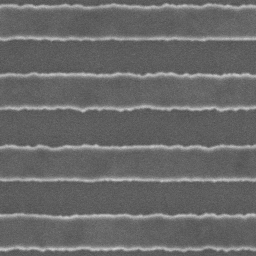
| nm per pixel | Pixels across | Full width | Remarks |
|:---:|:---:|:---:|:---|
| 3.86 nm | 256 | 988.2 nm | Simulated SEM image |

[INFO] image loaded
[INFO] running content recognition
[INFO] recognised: lines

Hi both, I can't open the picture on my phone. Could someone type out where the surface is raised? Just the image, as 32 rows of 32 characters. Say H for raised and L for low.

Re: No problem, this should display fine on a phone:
LLLLLLLLLLLLLLLLLLLLLLLLLLLLLLLL
HHHHHHHHHHHHHHHHHHHHHHHHHHHHHHHH
HHHHHHHHHHHHHHHHHHHHHHHHHHHHHHHH
HHHHHHHHHHHHHHHHHHHHHHHHHHHHHHHH
HHHHHHHHHHHHHHHHHHHHHHHHHHHHHHHH
LLLLLLLLLLLLLLLLLLLLLLLLLLLLLLLL
LLLLLLLLLLLLLLLLLLLLLLLLLLLLLLLL
LLLLLLLLLLLLLLLLLLLLLLLLLLLLLLLL
LLLLLLLLLLLLLLLLLLLLLLLLLLLLLLLL
HHHHHHHHHHHHHHHHHHHHHHHHHHHHHHHH
HHHHHHHHHHHHHHHHHHHHHHHHHHHHHHHH
HHHHHHHHHHHHHHHHHHHHHHHHHHHHHHHH
HHHHHHHHHHHHHHHHHHHHHHHHHHHHHHHH
HHHHHHHHHHHHHHHHHHHHHHHHHHHHHHHH
LLLLLLLLLLLLLLLLLLLLLLLLLLLLLLLL
LLLLLLLLLLLLLLLLLLLLLLLLLLLLLLLL
LLLLLLLLLLLLLLLLLLLLLLLLLLLLLLLL
LLLLLLLLLLLLLLLLLLLLLLLLLLLLLLLL
HHHHHHHHHHHHHHHHHHHHHHHHHHHHHHHH
HHHHHHHHHHHHHHHHHHHHHHHHHHHHHHHH
HHHHHHHHHHHHHHHHHHHHHHHHHHHHHHHH
HHHHHHHHHHHHHHHHHHHHHHHHHHHHHHHH
HHHHHHHHHHHHHHHHHHHHHHHHHHHHHHHH
LLLLLLLLLLLLLLLLLLLLLLLLLLLLLLLL
LLLLLLLLLLLLLLLLLLLLLLLLLLLLLLLL
LLLLLLLLLLLLLLLLLLLLLLLLLLLLLLLL
LLLLLLLLLLLLLLLLLLLLLLLLLLLLLLLL
HHHHHHHHHHHHHHHHHHHHHHHHHHHHHHHH
HHHHHHHHHHHHHHHHHHHHHHHHHHHHHHHH
HHHHHHHHHHHHHHHHHHHHHHHHHHHHHHHH
HHHHHHHHHHHHHHHHHHHHHHHHHHHHHHHH
LLLLLLLLLLLLLLLLLLLLLLLLLLLLLLLL